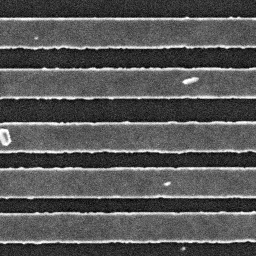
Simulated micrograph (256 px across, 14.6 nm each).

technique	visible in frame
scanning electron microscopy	lines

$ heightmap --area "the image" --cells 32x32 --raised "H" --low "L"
LLLLLLLLLLLLLLLLLLLLLLLLLLLLLLLL
LLLLLLLLLLLLLLLLLLLLLLLLLLLLLLLL
HHHHHHHHHHHHHHHHHHHHHHHHHHHHHHHH
HHHHHHHHHHHHHHHHHHHHHHHHHHHHHHHH
HHHHHHHHHHHHHHHHHHHHHHHHHHHHHHHH
HHHHHHHHHHHHHHHHHHHHHHHHHHHHHHHH
LLLLLLLLLLLLLLLLLLLLLLLLLLLLLLLL
LLLLLLLLLLLLLLLLLLLLLLLLLLLLLLLL
LLLLLLLLLLLLLLLLLLLLLLLLLLLLLLLL
HHHHHHHHHHHHHHHHHHHHHHHHHHHHHHHH
HHHHHHHHHHHHHHHHHHHHHHHHHHHHHHHH
HHHHHHHHHHHHHHHHHHHHHHHHHHHHHHHH
LLLLLLLLLLLLLLLLLLLLLLLLLLLLLLLL
LLLLLLLLLLLLLLLLLLLLLLLLLLLLLLLL
LLLLLLLLLLLLLLLLLLLLLLLLLLLLLLLL
HHHHHHHHHHHHHHHHHHHHHHHHHHHHHHHH
HHHHHHHHHHHHHHHHHHHHHHHHHHHHHHHH
HHHHHHHHHHHHHHHHHHHHHHHHHHHHHHHH
HHHHHHHHHHHHHHHHHHHHHHHHHHHHHHHH
LLLLLLLLLLLLLLLLLLLLLLLLLLLLLLLL
LLLLLLLLLLLLLLLLLLLLLLLLLLLLLLLL
HHHHHHHHHHHHHHHHHHHHHHHHHHHHHHHH
HHHHHHHHHHHHHHHHHHHHHHHHHHHHHHHH
HHHHHHHHHHHHHHHHHHHHHHHHHHHHHHHH
HHHHHHHHHHHHHHHHHHHHHHHHHHHHHHHH
LLLLLLLLLLLLLLLLLLLLLLLLLLLLLLLL
LLLLLLLLLLLLLLLLLLLLLLLLLLLLLLLL
HHHHHHHHHHHHHHHHHHHHHHHHHHHHHHHH
HHHHHHHHHHHHHHHHHHHHHHHHHHHHHHHH
HHHHHHHHHHHHHHHHHHHHHHHHHHHHHHHH
LLLLLLLLLLLLLLLLLLLLLLLLLLLLLLLL
LLLLLLLLLLLLLLLLLLLLLLLLLLLLLLLL